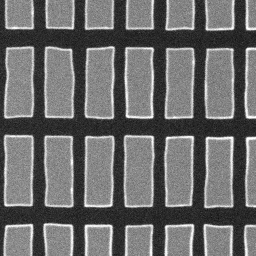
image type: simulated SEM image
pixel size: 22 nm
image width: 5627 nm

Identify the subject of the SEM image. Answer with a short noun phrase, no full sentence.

groups of lines, slits or small figures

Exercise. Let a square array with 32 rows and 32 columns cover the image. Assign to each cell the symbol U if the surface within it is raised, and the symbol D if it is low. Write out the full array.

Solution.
DUUUDDUUUDDUUUDDUUUDDUUUDDUUUDDU
DUUUDDUUUDDUUUDDUUUDDUUUDDUUUDDU
DUUUDDUUUDDUUUDDUUUDDUUUDDUUUDDU
DUUUDDUUUDDUUUDDUUUDDUUUDDUUUDDU
DDDDDDDDDDDDDDDDDDDDDDDDDDDDDDDD
DDDDDDDDDDDDDDDDDDDDDDDDDDDDDDDD
DUUUDDUUUDDUUUDDUUUDDUUUDDUUUDDU
DUUUDDUUUDDUUUDDUUUDDUUUDDUUUDDU
DUUUDDUUUDDUUUDDUUUDDUUUDDUUUDDU
DUUUDDUUUDDUUUDDUUUDDUUUDDUUUDDU
DUUUDDUUUDDUUUDDUUUDDUUUDDUUUDDU
DUUUDDUUUDDUUUDDUUUDDUUUDDUUUDDU
DUUUDDUUUDDUUUDDUUUDDUUUDDUUUDDU
DUUUDDUUUDDUUUDDUUUDDUUUDDUUUDDU
DUUDDDUUUDDUUUDDUUUDDUUUDDUUUDDU
DDDDDDDDDDDDDDDDDDDDDDDDDDDDDDDD
DDDDDDDDDDDDDDDDDDDDDDDDDDDDDDDD
DUUUDDUUUDDUUUDDUUUDDUUUDDUUUDDU
DUUUDDUUUDDUUUDDUUUDDUUUDDUUUDDU
DUUUDDUUUDDUUUDDUUUDDUUUDDUUUDDU
DUUUDDUUUDDUUUDDUUUDDUUUDDUUUDDU
DUUUDDUUUDDUUUDDUUUDDUUUDDUUUDDU
DUUUDDUUUDDUUUDDUUUDDUUUDDUUUDDU
DUUUDDUUUDDUUUDDUUUDDUUUDDUUUDDU
DUUUDDUUUDDUUUDDUUUDDUUUDDUUUDDU
DUUUDDUUUDDUUUDDUUUDDUUUDDUUUDDU
DDDDDDDDDDDDDDDDDDDDDDDDDDDDDDDD
DDDDDDDDDDDDDDDDDDDDDDDDDDDDDDDD
DUUUDDUUUDDUUUDDUUUDDUUUDDUUUDDU
DUUUDDUUUDDUUUDDUUUDDUUUDDUUUDDU
DUUUDDUUUDDUUUDDUUUDDUUUDDUUUDDU
DUUUDDUUUDDUUUDDUUUDDUUUDDUUUDDU